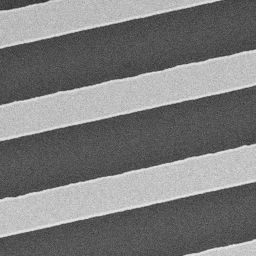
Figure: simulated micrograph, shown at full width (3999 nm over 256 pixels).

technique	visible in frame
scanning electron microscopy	lines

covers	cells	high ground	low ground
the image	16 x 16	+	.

.+++++++++++....
+++++++.........
++..............
..............++
..........++++++
.....++++++++++.
++++++++++......
++++++..........
+...............
..............++
.........+++++++
.....++++++++++.
+++++++++++.....
++++++..........
++..............
..............++